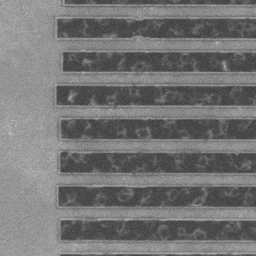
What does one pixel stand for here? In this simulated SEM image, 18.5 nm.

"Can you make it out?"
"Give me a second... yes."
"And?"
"parallel lines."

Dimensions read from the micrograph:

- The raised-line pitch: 623 nanometers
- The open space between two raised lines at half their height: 12 px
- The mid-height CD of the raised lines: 400 nanometres